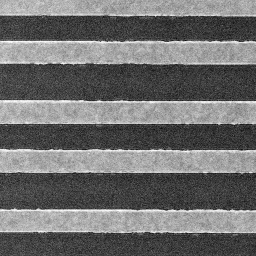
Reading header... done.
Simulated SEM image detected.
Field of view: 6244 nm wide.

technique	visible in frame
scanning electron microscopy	lines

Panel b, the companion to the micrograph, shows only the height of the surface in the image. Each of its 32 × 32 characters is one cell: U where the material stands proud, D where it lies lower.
UUUUUUUUUUUUUUUUUUUUUUUUUUUUUUUU
UUUUUUUUUUUUUUUUUUUUUUUUUUUUUUUU
DDDDDDDDDDDDDDDDDDDDDDDDDDDDDDDD
DDDDDDDDDDDDDDDDDDDDDDDDDDDDDDDD
DDDDDDDDDDDDDDDDDDDDDDDDDDDDDDDD
UUUUUUUUUUUUUUUUUUUUUUUUUUUUUUUU
UUUUUUUUUUUUUUUUUUUUUUUUUUUUUUUU
UUUUUUUUUUUUUUUUUUUUUUUUUUUUUUUU
DDDDDDDDDDDDDDDDDDDDDDDDDDDDDDDD
DDDDDDDDDDDDDDDDDDDDDDDDDDDDDDDD
DDDDDDDDDDDDDDDDDDDDDDDDDDDDDDDD
DDDDDDDDDDDDDDDDDDDDDDDDDDDDDDDD
DDDDDDDDDDDDDDDDDDDDDDDDDDDDDDDD
UUUUUUUUUUUUUUUUUUUUUUUUUUUUUUUU
UUUUUUUUUUUUUUUUUUUUUUUUUUUUUUUU
DDDDDDDDDDDDDDDDDDDDDDDDDDDDDDDD
DDDDDDDDDDDDDDDDDDDDDDDDDDDDDDDD
DDDDDDDDDDDDDDDDDDDDDDDDDDDDDDDD
DDDDDDDDDDDDDDDDDDDDDDDDDDDDDDDD
UUUUUUUUUUUUUUUUUUUUUUUUUUUUUUUU
UUUUUUUUUUUUUUUUUUUUUUUUUUUUUUUU
DDDDDDDDDDDDDDDDDDDDDDDDDDDDDDUD
DDDDDDDDDDDDDDDDDDDDDDDDDDDDDDDD
DDDDDDDDDDDDDDDDDDDDDDDDDDDDDDDD
DDDDDDDDDDDDDDDDDDDDDDDDDDDDDDDD
DDDDDDDDDDDDDDDDDDDDDDDDDDDDDDDD
UUUUUUUUUUUUUUUUUUUUUUUUUUUUUUUU
UUUUUUUUUUUUUUUUUUUUUUUUUUUUUUUU
UUUUUUUUUUUUUUUUUUUUUUUUUUUUUUUU
DDDDDDDDDDDDDDDDDDDDDDDDDDDDDDDD
DDDDDDDDDDDDDDDDDDDDDDDDDDDDDDDD
DDDDDDDDDDDDDDDDDDDDDDDDDDDDDDDD